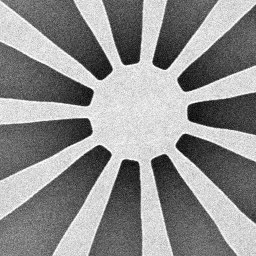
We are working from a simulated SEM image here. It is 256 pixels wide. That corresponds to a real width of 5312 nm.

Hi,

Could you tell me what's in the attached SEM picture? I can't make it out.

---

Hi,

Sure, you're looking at groups of lines, slits or small figures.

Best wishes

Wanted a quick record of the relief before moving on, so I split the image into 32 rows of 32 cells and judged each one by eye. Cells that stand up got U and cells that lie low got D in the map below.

UDDDDDDDDDUUUDDDDDUUUDDDDDDUUUUU
UUDDDDDDDDUUUDDDDDUUUDDDDDUUUUUD
UUUDDDDDDDDUUDDDDDUUDDDDDDUUUUDD
UUUUDDDDDDDUUUDDDDUUDDDDDUUUUDDD
UUUUUUDDDDDDUUDDDDUUDDDDUUUUDDDD
DUUUUUUDDDDDUUDDDDUUDDDUUUUDDDDD
DDDUUUUUDDDDDUUDDDUDDDDUUUDDDDDD
DDDDDUUUUDDDDDUDDUUDDDUUDDDDDDDD
DDDDDDDUUUUDDDUUUUUUDUUDDDDDDDDU
DDDDDDDDUUUUDDUUUUUUUUDDDDDDDUUU
DDDDDDDDDDUUUUUUUUUUUUDDDDUUUUUU
DDDDDDDDDDDDUUUUUUUUUUUUUUUUUUUU
UUDDDDDDDDDDUUUUUUUUUUUUUUUDDDDD
UUUUUUUUUUUUUUUUUUUUUUUDDDDDDDDD
UUUUUUUUUUUUUUUUUUUUUUUDDDDDDDDD
DDDDDDDDDDDUUUUUUUUUUUUUUDDDDDDD
DDDDDDDDDDDDUUUUUUUUUUUUUUUUUUDD
DDDDDDDDDDUUUUUUUUUUUUDDDDUUUUUU
DDDDDDDDUUUUDUUUUUUUUUDDDDDDUUUU
DDDDDDDUUUDDDDUUUUUUDUUDDDDDDDUU
DDDDUUUUUDDDDUUDDUUDDDUUDDDDDDDD
DDUUUUUUDDDDDUUDDDUDDDUUUDDDDDDD
UUUUUUUDDDDDUUDDDDUDDDDUUUDDDDDD
UUUUUDDDDDDDUUDDDDUUDDDDUUUDDDDD
UUUUDDDDDDDUUUDDDDUUDDDDUUUUDDDD
UUUDDDDDDDDUUDDDDDUUDDDDDUUUUDDD
UDDDDDDDDDUUUDDDDDUUDDDDDDUUUUDD
DDDDDDDDDUUUUDDDDDUUDDDDDDDUUUUD
DDDDDDDDDUUUDDDDDDUUUDDDDDDUUUUU
DDDDDDDDUUUUDDDDDDUUUDDDDDDDUUUU
DDDDDDDUUUUDDDDDDDUUUDDDDDDDDUUU
DDDDDDDUUUUDDDDDDDUUUUDDDDDDDUUU